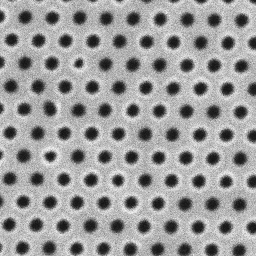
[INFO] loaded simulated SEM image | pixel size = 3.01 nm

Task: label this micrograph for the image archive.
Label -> a regular array of holes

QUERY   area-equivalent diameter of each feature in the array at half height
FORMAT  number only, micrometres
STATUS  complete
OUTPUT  0.0429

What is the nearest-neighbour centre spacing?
0.0792 um